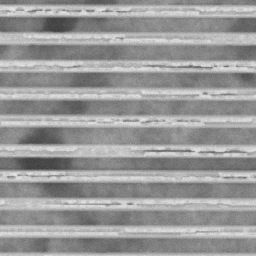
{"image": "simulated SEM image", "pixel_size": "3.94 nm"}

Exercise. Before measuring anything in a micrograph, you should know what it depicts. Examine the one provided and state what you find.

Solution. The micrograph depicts parallel lines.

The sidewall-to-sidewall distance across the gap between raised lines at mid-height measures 66.9 nanometers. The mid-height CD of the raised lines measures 10.4 pixels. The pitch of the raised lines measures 109 nm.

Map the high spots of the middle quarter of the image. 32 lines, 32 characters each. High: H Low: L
HHHHHHHHHHHHHHHHHHHHHHHHHHHHHHHH
HHHHHHHHHHHHHHHHHHHHHHHHHHHHHHHH
LLLLLLLLLLLLLLLLLLLLLLLLLLLLLLLL
LLLLLLLLLLLLLLLLLLLLLLLLLLLLLLLL
LLLLLLLLLLLLLLLLLLLLLLLLLLLLLLLL
LLLLLLLLLLLLLLLLLLLLLLLLLLLLLLLL
HHHHHHHHHHHHHHHHHHHHHHHHHHHHHHHH
HHHHHHHHHHHHHHHHHHHHHHHHHHHHHHHH
HHHHHHHHHHHHHHHHHHHHHHHHHHHHHHHH
LLLLLLLLLLLLLLLLLLLLLLLLLLLLLLLL
LLLLLLLLLLLLLLLLLLLLLLLLLLLLLLLL
LLLLLLLLLLLLLLLLLLLLLLLLLLLLLLLL
LLLLLLLLLLLLLLLLLLLLLLLLLLLLLLLL
HHHHHHHHHHHHHHHHHHHHHHHHHHHHHHHH
HHHHHHHHHHHHHHHHHHHHHHHHHHHHHHHH
LLLLLLLLLLLLLLLLLLLLLLLLLLLLLHHH
LLLLLLLLLLLLLLLLLLLLLLLLLLLLLLLL
LLLLLLLLLLLLLLLLLLLLLLLLLLLLLLLL
LLLLLLLLLLLLLLLLLLLLLLLLLLLLLLLL
LLLLLLLLLLLLLLLLLLLLLLLLLLLLLLLL
LLLLLLLLLLLLLLLLLLLLLLLLLLLLLLLL
HHHHHHHHHHHHHHHHHHHHHHHHHHHHHHHH
HHHHHHHHHHHHHHHHHHHHHHHHHHHHHHHH
LLLLLLLLLLLLLLLLLLLLLLLLLLLLLLLL
LLLLLLLLLLLLLLLLLLLLLLLLLLLLLLLL
LLLLLLLLLLLLLLLLLLLLLLLLLLLLLLLL
LLLLLLLLLLLLLLLLLLLLLLLLLLLLLLLL
HHHHHHHHHHHHHHHHHHHHHHHHHHHHHHHH
HHHHHHHHHHHHHHHHHHHHHHHHHHHHHHHH
LLLLLLLLLLLLLLLLLLLLLLLLLLLLLLLL
LLLLLLLLLLLLLLLLLLLLLLLLLLLLLLLL
LLLLLLLLLLLLLLLLLLLLLLLLLLLLLLLL